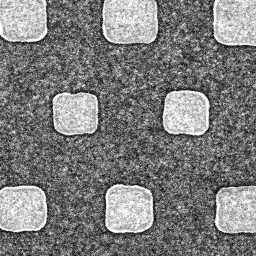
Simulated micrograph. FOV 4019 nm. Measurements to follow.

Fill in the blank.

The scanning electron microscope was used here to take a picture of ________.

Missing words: raised bodies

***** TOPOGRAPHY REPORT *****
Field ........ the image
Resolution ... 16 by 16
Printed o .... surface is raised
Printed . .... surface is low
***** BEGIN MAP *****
ooo...oooo...ooo
ooo...oooo...ooo
.o.....oo.....oo
................
................
................
...ooo....ooo...
...ooo....ooo...
................
................
................
................
ooo....ooo....oo
ooo....ooo....oo
..............oo
................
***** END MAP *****